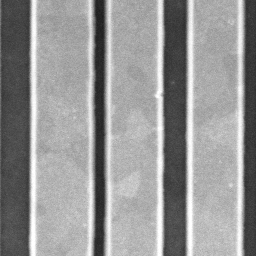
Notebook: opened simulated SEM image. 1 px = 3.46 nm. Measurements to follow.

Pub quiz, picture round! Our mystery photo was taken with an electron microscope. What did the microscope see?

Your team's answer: one or a few lines or trenches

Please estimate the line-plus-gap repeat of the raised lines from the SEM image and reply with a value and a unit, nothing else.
264 nanometers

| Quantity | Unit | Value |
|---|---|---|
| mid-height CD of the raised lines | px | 52.4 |